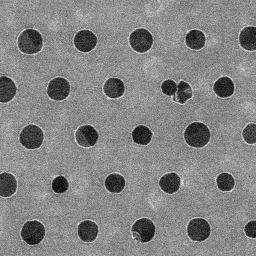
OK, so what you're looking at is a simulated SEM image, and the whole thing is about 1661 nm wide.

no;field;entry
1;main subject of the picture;a regular array of raised bodies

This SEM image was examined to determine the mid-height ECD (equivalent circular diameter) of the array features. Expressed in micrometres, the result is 0.156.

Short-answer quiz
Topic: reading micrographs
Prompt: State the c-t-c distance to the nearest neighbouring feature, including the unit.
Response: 354 nanometers